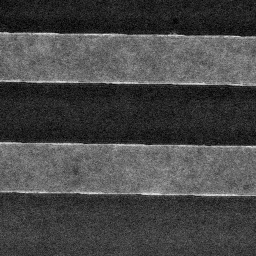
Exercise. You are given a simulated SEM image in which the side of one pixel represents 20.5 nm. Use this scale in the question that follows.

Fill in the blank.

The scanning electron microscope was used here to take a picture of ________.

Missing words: lines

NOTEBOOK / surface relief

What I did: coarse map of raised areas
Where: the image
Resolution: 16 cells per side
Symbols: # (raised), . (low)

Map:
................
................
################
################
################
................
................
................
................
################
################
################
................
................
................
................